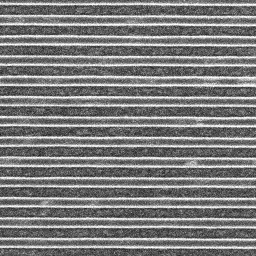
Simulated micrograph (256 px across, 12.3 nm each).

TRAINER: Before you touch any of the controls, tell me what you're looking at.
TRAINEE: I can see parallel lines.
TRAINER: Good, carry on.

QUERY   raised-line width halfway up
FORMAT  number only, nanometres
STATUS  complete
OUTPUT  111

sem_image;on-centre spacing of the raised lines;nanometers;250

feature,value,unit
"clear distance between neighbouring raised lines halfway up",145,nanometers